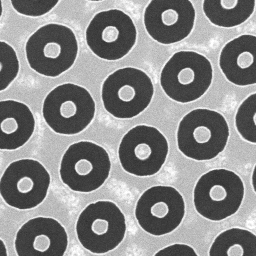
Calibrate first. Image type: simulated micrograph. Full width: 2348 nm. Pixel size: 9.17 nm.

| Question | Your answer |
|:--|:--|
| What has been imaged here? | a regular array of ring-shaped grooves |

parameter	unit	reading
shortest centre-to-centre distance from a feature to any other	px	60.1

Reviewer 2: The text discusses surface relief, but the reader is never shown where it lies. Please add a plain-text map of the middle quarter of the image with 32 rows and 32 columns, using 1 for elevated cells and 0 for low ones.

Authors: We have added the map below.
00111111111111111111111110000000
01111111111110000001111110000011
11111111111100000000011100000111
11111111111000000000011100000111
11111111110000000000001100000111
00001111110000010000001100000000
00000011100000111000001110000000
00000001100000111100001111000000
00000001100000111000001111100000
11000000110000000000001111111001
11100000110000000000011111111111
11100000111000000000111111111111
11000000111100000001111111111110
00000001111111000111111111111100
00000001111111111111111111111000
00000011111111111100011111111000
00000111111111110000000011111000
00111111111111100000000011110000
11111111111111100000000001110000
11110001111111000000000000110000
10000000011111000011100000111000
10000000001111000011110000111000
00000000000111000011100000111100
00000000000111000001100000111111
00001100000011000000000001111111
00011110000011000000000011111111
00011110000011100000000011111111
00001100000111111000000111111111
00000000000111111111111111111111
00000000001111111111111111111111
10000000011111111111111101111111
11000000111111111111100000001111